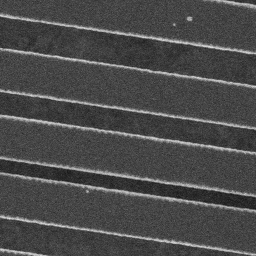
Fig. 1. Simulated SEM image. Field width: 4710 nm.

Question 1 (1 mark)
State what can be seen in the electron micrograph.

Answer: lines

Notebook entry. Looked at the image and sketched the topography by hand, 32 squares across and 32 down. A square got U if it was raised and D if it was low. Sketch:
UUUUUUUUUUUUUUUUUUUUUUUUUUUUUUUD
UUUUUUUUUUUUUUUUUUUUUUUUUUUUUUUU
DDDUUUUUUUUUUUUUUUUUUUUUUUUUUUUU
DDDDDDDDDDUUUUUUUUUUUUUUUUUUUUUU
DDDDDDDDDDDDDDDDDUUUUUUUUUUUUUUU
DDDDDDDDDDDDDDDDDDDDDDDDUUUUUUUU
UUUDDDDDDDDDDDDDDDDDDDDDDDDDDDUU
UUUUUUUUUUDDDDDDDDDDDDDDDDDDDDDD
UUUUUUUUUUUUUUUUDDDDDDDDDDDDDDDD
UUUUUUUUUUUUUUUUUUUUUUUUDDDDDDDD
UUUUUUUUUUUUUUUUUUUUUUUUUUUUUUDD
DUUUUUUUUUUUUUUUUUUUUUUUUUUUUUUU
DDDDDDDUUUUUUUUUUUUUUUUUUUUUUUUU
DDDDDDDDDDDDDDUUUUUUUUUUUUUUUUUU
UDDDDDDDDDDDDDDDDDDDDUUUUUUUUUUU
UUUUUUUUDDDDDDDDDDDDDDDDDDDUUUUU
UUUUUUUUUUUUUUDDDDDDDDDDDDDDDDDD
UUUUUUUUUUUUUUUUUUUUUDDDDDDDDDDD
UUUUUUUUUUUUUUUUUUUUUUUUUUUUDDDD
UUUUUUUUUUUUUUUUUUUUUUUUUUUUUUUU
DDDDUUUUUUUUUUUUUUUUUUUUUUUUUUUU
DDDDDDDDDDDUUUUUUUUUUUUUUUUUUUUU
UUUUUUDDDDDDDDDDDDDUUUUUUUUUUUUU
UUUUUUUUUUUUUDDDDDDDDDDDDUUUUUUU
UUUUUUUUUUUUUUUUUUUUDDDDDDDDDDDU
UUUUUUUUUUUUUUUUUUUUUUUUUUDDDDDD
UUUUUUUUUUUUUUUUUUUUUUUUUUUUUUUU
DDUUUUUUUUUUUUUUUUUUUUUUUUUUUUUU
DDDDDDDDDUUUUUUUUUUUUUUUUUUUUUUU
DDDDDDDDDDDDDDDUUUUUUUUUUUUUUUUU
DDDDDDDDDDDDDDDDDDDDDDUUUUUUUUUU
UUUDDDDDDDDDDDDDDDDDDDDDDDDDDUUU